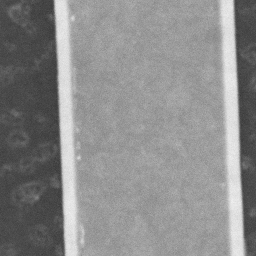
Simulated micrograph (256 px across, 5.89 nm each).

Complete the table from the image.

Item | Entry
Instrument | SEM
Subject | one or a few lines or trenches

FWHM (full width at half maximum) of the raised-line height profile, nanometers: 976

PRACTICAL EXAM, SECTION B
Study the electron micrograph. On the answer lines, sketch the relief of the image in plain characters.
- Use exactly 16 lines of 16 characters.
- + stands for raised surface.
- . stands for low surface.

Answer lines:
....++++++++++..
....++++++++++..
....++++++++++..
....++++++++++..
....++++++++++..
....++++++++++..
....++++++++++..
....++++++++++..
....+++++++++++.
....+++++++++++.
....+++++++++++.
....+++++++++++.
....+++++++++++.
....+++++++++++.
....+++++++++++.
....+++++++++++.